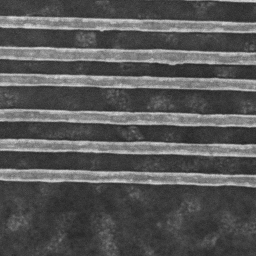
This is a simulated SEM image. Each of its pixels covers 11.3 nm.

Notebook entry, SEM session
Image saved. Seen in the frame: parallel lines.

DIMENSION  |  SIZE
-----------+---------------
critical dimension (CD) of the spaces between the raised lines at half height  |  0.227 µm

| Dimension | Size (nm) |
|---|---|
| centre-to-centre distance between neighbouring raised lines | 345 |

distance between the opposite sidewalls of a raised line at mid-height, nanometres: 119